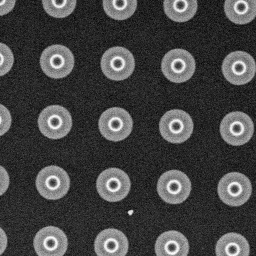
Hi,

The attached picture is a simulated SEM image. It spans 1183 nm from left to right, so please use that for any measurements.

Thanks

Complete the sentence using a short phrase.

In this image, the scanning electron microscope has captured an array of small figures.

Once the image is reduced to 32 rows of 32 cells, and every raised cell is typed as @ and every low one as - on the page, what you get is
@@---@@@@----@@@@---@@@@@---@@@@
@-----@@@----@@@@----@@@----@@@@
----------------------@@-----@@@
--------------------------------
--------------------------------
--------------------------------
@----@@@@----@@@-----@@@-----@@-
@@---@@@@----@@@@---@@@@----@@@@
@----@@@@----@@@@---@@@@----@@@@
------@@-----@@@-----@@@----@@@@
-----------------------------@--
--------------------------------
--------------------------------
@-----@@------@-----------------
@----@@@@----@@@----@@@@----@@@-
@----@@@@---@@@@@---@@@@----@@@@
@----@@@@----@@@----@@@@----@@@@
--------------@------@@-----@@@-
--------------------------------
--------------------------------
--------------------------------
@----@@@-----@@------@@---------
@----@@@@---@@@@----@@@@----@@@-
@----@@@@---@@@@----@@@@---@@@@-
-----@@@-----@@@----@@@@---@@@@-
----------------------------@@--
--------------------------------
--------------------------------
-----@@-------------------------
@---@@@@----@@@@----@@@-----@@--
@---@@@@----@@@@---@@@@@---@@@@-
-----@@@----@@@@---@@@@@---@@@@-